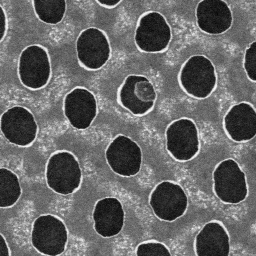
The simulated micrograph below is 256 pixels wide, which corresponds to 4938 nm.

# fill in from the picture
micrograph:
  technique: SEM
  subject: a regular array of holes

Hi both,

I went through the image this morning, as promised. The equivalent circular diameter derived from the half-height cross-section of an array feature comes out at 726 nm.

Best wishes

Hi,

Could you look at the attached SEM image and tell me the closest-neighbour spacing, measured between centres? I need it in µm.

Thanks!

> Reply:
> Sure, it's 1.19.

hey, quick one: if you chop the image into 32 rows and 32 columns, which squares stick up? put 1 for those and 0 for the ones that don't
11110000111110011111111110001111
01110000111111111111111110000111
01111000111111111100011110000111
01111111111111111000011110000111
11111111110001111000011111111111
11111111110000111000011111111111
11100011110000111111111111111110
11000011110001111111111100111110
11000011111011111111111000011110
11000011111111110111110000011110
11100011111111100001111000011111
11111111100111100001111000111111
11111111000011100001111111111111
10011111000011110001111111111000
00001111000011111111111111110000
00000111100111111111100011110000
00000111111111111111100001110000
10001111111111001111100001111001
11111111111110000111100001111111
11111100011110000011110011111111
11111100001111000011111111100011
00111100001111000111111111100011
00111100001111111111111111100001
00011100001111111110000111100001
00111111111111111110000111100001
00111111111100011110000111111111
11111111111100011110000111111111
11111000111100011111101111111111
11110000111100011111111110001111
11110000111110111111111110000111
01110000111111111100111100000111
01111000111111111000011100000111